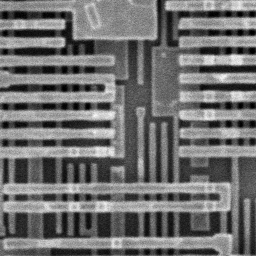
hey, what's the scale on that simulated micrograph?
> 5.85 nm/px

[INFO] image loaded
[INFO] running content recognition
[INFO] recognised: wiring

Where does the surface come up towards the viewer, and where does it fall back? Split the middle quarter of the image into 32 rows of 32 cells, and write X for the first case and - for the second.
--------------------------------
--------------------------------
--------------------------------
XXXXXXXXXXXXX----------------XXX
XXXXXXXXXXXXX----------------XXX
----------XXX-------------------
----------XXX-------------------
XXXXXXXXXXXXX----------------XXX
XXXXXXXXXXXXX----------------XXX
--------------------------------
--------------------------------
--------------------------------
XXXXXXXXXXXXX----------------XXX
XXXXXXXXXXXXX----------------XXX
--------------------------------
--------------------------------
XXX--XXXXXXXX----------------XXX
XXXXXXXXXXXXX----------------XXX
--------------------------------
--------------------------------
--------------------------------
XXXXXXXXXXXXX----------------XXX
XXXXXXXXXXXXX----------------XXX
--------------------------------
--------------------------------
--------------------------------
--------------------------------
--------------------------------
--------------------------------
--------------------------------
XXXXXXXXXXXXXXXXXXXXXXXXXXXXXXXX
XXXXXXXXXXXXXXXXXXXXXXXXXXXXXXXX